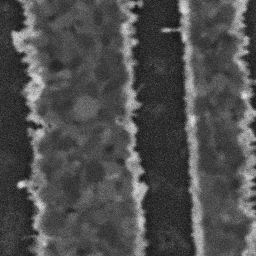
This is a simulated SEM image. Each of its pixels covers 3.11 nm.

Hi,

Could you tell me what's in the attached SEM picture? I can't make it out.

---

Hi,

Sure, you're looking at one or a few lines or trenches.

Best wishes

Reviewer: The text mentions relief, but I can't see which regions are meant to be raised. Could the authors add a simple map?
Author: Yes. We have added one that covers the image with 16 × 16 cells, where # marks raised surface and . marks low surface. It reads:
..######...####.
..######...####.
.#######....###.
..######....###.
..######....###.
..######....####
..######....####
..######....###.
..######....###.
..######....####
..#######...####
..#######...####
..#######...###.
..#######...####
..#######...####
..#######...####